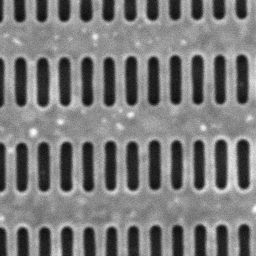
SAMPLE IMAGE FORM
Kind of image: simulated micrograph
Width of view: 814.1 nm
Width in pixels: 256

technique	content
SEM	groups of lines, slits or small figures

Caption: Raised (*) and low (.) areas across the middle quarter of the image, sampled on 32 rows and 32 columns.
..**...***...**...***...**....**
..**...***...**...***...**....**
..**...***...**...***...**....**
..**...***...**...***...**....**
..**...***...**...***...**....**
..**...***...**....**...**....**
..**...***...**....**...**....**
..**...***...**....**...**....**
..**...***...**....**...**....**
..***..***...**...***...***..***
.****.****..****.***************
********************************
********************************
********************************
********************************
********************************
********************************
********************************
********************************
..***..***...***..***...***..***
..***..***...**....**...***...**
..**...***...**....**...**....**
..**...***...**....**...***...**
..**...***...**....**...***...**
..**...***...**....**...***...**
..***...**...**....**...**....**
..***...**...**....**...**....**
..***...**...**....**...**....**
..***...**...**....**...**....**
..***...**...**....**...***...**
...**...**...**....**...***...**
..***..****..***..****..****.***